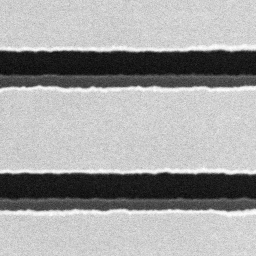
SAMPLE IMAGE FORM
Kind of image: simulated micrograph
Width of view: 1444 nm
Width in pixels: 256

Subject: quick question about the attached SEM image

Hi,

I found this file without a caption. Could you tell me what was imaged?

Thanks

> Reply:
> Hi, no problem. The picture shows lines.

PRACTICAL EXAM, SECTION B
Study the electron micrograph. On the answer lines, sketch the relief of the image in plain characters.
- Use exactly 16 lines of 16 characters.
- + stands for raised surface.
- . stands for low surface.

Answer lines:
++++++++++++++++
++++++++++++++++
++++++++++++++++
................
................
++++++++++++++++
++++++++++++++++
++++++++++++++++
++++++++++++++++
++++++++++++++++
++++++++++++++++
................
................
++++++++++++++++
++++++++++++++++
++++++++++++++++